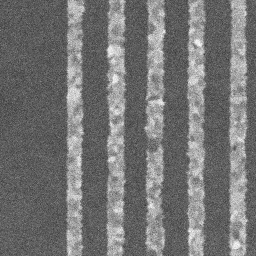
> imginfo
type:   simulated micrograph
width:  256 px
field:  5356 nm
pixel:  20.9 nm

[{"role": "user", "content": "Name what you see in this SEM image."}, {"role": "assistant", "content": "parallel lines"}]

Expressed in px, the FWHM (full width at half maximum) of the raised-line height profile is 14.2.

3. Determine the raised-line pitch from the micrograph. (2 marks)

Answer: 854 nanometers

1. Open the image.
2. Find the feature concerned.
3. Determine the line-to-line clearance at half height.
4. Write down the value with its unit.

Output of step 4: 0.56 um